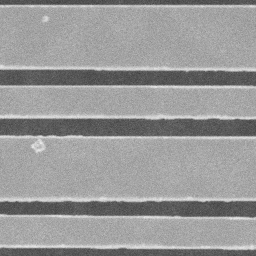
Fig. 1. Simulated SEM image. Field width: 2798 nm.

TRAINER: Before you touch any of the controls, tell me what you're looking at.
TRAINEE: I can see lines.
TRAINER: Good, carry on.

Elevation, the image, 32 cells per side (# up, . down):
................................
################################
################################
################################
################################
################################
################################
################################
################################
................................
................................
################################
################################
################################
################################
................................
................................
################################
################################
################################
################################
################################
################################
################################
################################
................................
................................
################################
################################
################################
################################
................................